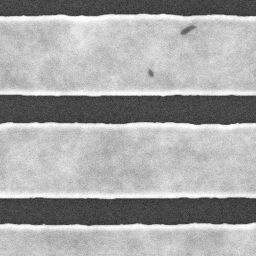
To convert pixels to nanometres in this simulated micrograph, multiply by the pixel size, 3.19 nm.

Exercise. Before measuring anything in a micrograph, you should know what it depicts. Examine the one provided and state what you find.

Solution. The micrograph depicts lines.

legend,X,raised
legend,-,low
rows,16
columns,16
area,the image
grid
----------------
XXXXXXXXXXXXXXXX
XXXXXXXXXXXXXXXX
XXXXXXXXXXXXXXXX
XXXXXXXXXXXXXXXX
XXXXXXXXXXXXXXXX
----------------
----------------
XXXXXXXXXXXXXXXX
XXXXXXXXXXXXXXXX
XXXXXXXXXXXXXXXX
XXXXXXXXXXXXXXXX
----------------
----------------
XXXXXXXXXXXXXXXX
XXXXXXXXXXXXXXXX